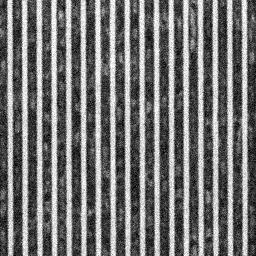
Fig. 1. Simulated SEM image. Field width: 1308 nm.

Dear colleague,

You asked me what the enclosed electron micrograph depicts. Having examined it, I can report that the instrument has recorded parallel lines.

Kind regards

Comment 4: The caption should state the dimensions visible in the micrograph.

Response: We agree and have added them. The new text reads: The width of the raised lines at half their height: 22.3 nm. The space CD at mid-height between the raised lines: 53 nanometres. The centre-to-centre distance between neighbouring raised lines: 74.8 nm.